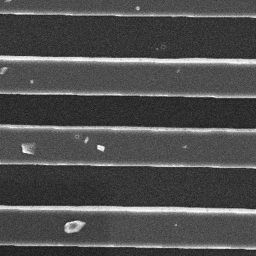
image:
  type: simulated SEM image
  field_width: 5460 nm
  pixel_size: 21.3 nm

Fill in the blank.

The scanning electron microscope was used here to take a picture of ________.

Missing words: lines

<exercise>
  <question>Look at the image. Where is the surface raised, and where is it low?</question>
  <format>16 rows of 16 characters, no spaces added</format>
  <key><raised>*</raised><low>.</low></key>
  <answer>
****************
................
................
................
****************
****************
................
................
****************
****************
................
................
................
****************
****************
.............***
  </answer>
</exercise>